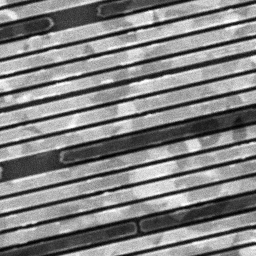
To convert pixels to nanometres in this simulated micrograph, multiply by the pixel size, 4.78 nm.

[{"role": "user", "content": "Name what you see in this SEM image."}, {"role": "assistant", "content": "parallel lines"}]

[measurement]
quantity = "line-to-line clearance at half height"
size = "26.8 nm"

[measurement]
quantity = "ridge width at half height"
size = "54.8 nm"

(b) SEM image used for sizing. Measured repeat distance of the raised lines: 80.4 nanometres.